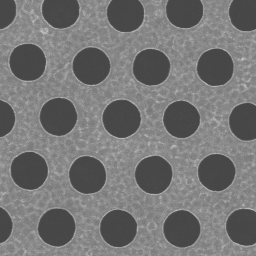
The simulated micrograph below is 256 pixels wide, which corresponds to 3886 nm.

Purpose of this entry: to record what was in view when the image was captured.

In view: a regular array of holes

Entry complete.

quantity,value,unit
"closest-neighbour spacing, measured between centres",917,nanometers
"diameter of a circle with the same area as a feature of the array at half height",570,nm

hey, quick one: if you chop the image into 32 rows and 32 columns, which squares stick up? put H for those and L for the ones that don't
LLHHHLLLLLHHHHLLLLHHHLLLLHHHHLLL
LLHHHLLLLLHHHLLLLLHHHLLLLHHHHLLL
LLHHHHLLLLHHHLLLLLHHHLLLLHHHHLLL
LHHHHHHLHHHHHHLLLHHHHHHHHHHHHHLL
HHHHHHHHHHHHHHHHHHHHHHHHHHHHHHHH
HHHLHHHHHHHHHHHHHHHHHHHHHHHHHHHH
HHLLLHHHHHLLLHHHHHLLHHHHHHLLHHHH
HLLLLLHHHLLLLLHHHLLLLHHHHLLLLHHH
HLLLLLHHHLLLLLHHHLLLLHHHHLLLLHHH
HHLLLHHHHLLLLHHHHLLLLHHHHLLLLHHH
HHHHHHHHHHHLHHHHHHLLHHHHHHLLHHHH
HHHHHHHHHHHHHHHHHHHHHHHHHHHHHHHH
HHHHHHLLLHHHHHHHHHHHHHHHHHHHHHHH
LHHHHLLLLHHHHLLLLHHHHLLLHHHHHLLL
LLHHHLLLLLHHHLLLLLHHLLLLLHHHHLLL
LLHHHLLLLHHHHLLLLHHHLLLLLHHHHLLL
LHHHHHLLLHHHHHLLLHHHHLLLHHHHHLLL
HHHHHHHHHHHHHHHHHHHHHHHHHHHHHHLL
HHHHHHHHHHHHHHHHHHHHHHHHHHHHHHHH
HHLLLHHHHHHHHHHHHHHLHHHHHHLLHHHH
HLLLLLHHHLLLLHHHHLLLLHHHHLLLLHHH
HLLLLLHHHLLLLHHHHLLLLLHHHLLLLHHH
HHLLLLHHHLLLLHHHHLLLLHHHHLLLLHHH
HHHLLHHHHLLLLHHHHHLLLHHHHHLLHHHH
HHHHHHHHHHHHHHHHHHHHHHHHHHHHHHHH
HHHHHHHHHHHHHHHHHHHHHHHHHHHHHHHH
LHHHHHLLLHHHHHLLHHHHHHLLHHHHHLLL
LHHHHLLLLHHHHLLLLHHHHLLLLHHHLLLL
LLHHHLLLLHHHLLLLLHHHLLLLLHHHLLLL
LHHHHLLLLHHHHLLLLHHHHLLLLHHHHLLL
HHHHHHLLHHHHHHLLHHHHHLLLHHHHHHLL
HHHHHHHHHHHHHHHHHHHHHHHHHHHHHHHH